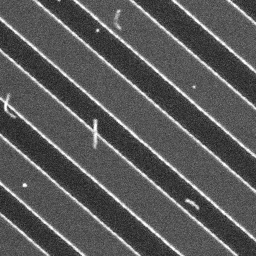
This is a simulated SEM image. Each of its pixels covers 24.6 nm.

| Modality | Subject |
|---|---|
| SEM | lines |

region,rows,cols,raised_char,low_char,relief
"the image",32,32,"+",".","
+++++.....+++++++.....+++++++...
++++++.....+++++++.....+++++++..
+++++++.....+++++++.....++++++++
.+++++++.....+++++++......++++++
..++++++++....++++++++.....+++++
....+++++++.....+++++++.....++++
.....+++++++.....+++++++.....+++
++....+++++++.....+++++++.....++
+++....+++++++.....+++++++.....+
++++....+++++++.....+++++++.....
+++++....++++++++....++++++++...
++++++.....+++++++.....+++++++..
+++++++.....+++++++.....+++++++.
.+++++++.....+++++++.....+++++++
..++++++++....+++++++.....++++++
....+++++++....+++++++.....+++++
.....+++++++....+++++++.....++++
+.....+++++++....++++++++....+++
++.....+++++++.....+++++++.....+
+++.....+++++++.....+++++++.....
++++.....+++++++.....+++++++....
+++++.....++++++++....+++++++...
+++++++.....+++++++....+++++++..
.+++++++.....+++++++....++++++++
..+++++++.....+++++++.....++++++
...+++++++.....+++++++.....+++++
....+++++++.....+++++++.....++++
+....+++++++.....++++++++....+++
++....++++++++.....+++++++....++
+++....++++++++.....+++++++....+
++++.....+++++++.....+++++++....
++++++....+++++++.....+++++++...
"